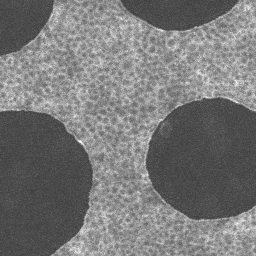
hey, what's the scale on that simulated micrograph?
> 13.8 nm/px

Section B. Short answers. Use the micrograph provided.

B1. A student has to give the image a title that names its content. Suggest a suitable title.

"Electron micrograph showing holes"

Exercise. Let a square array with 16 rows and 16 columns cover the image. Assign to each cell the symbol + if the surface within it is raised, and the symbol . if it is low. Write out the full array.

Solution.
...+++++.......+
...++++++....+++
..++++++++++++++
++++++++++++++++
++++++++++++++++
++++++++++++++++
+++++++++++....+
....++++++......
.....++++.......
.....++++.......
......+++.......
......+++.......
......++++......
.....+++++++...+
.....+++++++++++
....++++++++++++